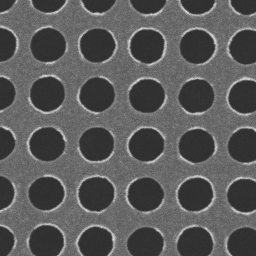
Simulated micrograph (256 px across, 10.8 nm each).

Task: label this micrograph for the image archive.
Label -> a regular array of holes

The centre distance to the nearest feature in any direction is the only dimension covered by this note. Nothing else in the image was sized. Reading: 529 nanometers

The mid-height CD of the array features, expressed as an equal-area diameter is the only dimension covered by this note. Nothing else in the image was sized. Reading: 378 nm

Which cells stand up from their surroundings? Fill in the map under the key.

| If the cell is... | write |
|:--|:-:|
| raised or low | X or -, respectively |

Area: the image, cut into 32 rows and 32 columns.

--XX----XX----XX-----XX----XX---
XXXXX--XXXX--XXXX---XXXX--XXXX--
XXXXXXXXXXXXXXXXXXXXXXXXXXXXXXXX
XXXXXX-XXXXXXXXXXXXXXXXXXXXXXXXX
--XX----XX----XXX---XXX---XXX---
--XX----XX----XX-----X-----XX---
--XX----XX----XX----XXX----XX---
-XXXX--XXXX--XXXX---XXX---XXX---
XXXXXXXXXXXXXXXXXXXXXXXXXXXXXXXX
XXXXXXXXXXXXXXXXXXXXXXXXXXXXXXXX
--XX----XXX---XXX---XXX---XXX---
--XX----XX----XX-----X-----XX---
--XX----XX----XX-----X-----XX---
-XXXX--XXXX---XXX---XXX---XXX---
XXXXXXXXXXXXXXXXXXXXXXXXXXXXXXXX
XXXXXXXXXXXXXXXXXXXXXXXXXXXXXXXX
-XXX---XXXX---XXX---XXX---XXX---
--XX----XX----XX----XX-----XX---
--XX----XX----XX----XX-----X----
-XXX---XXX----XXX---XXX---XXX---
XXXXXXXXXXXXXXXXXXXXXXXXXXXXXXXX
XXXXXXXXXXXXXXXXXXXXXXXXXXXXXXXX
-XXXX--XXXX--XXXX--XXXX---XXXX-X
--XX----XX----XX----XX-----XX---
--XX----XX----XX----XX-----X----
-XXX---XXX----XX----XXX---XXX---
XXXXXXXXXXXXXXXXXXXXXXXXXXXXXX-X
XXXXXXXXXXXXXXXXXXXXXXXXXXXXXXXX
-XXXX--XXXX--XXXXX-XXXXX-XXXXX-X
--XX----XX----XX----XXX---XXX---
--XX----XX----XX----XX-----X----
-XXX----XX----XX----XX----XXX---